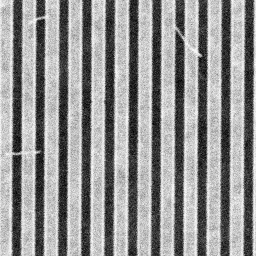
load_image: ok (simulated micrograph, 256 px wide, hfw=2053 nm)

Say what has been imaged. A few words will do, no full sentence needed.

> parallel lines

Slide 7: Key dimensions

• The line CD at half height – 89.3 nanometers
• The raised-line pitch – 186 nanometres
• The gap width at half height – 95.3 nanometres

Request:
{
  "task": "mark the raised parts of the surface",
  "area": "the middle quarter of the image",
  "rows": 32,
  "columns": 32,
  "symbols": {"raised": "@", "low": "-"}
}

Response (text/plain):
-@@@---@@@---@@@---@@----@@---@@
-@@@---@@@---@@@---@@----@@---@@
-@@@---@@@---@@@---@@----@@---@@
-@@@---@@@---@@@---@@----@@---@@
-@@@---@@@---@@@---@@----@@---@@
-@@@---@@@---@@@---@@----@@---@@
-@@@---@@@---@@@---@@----@@---@@
-@@@---@@@---@@@---@@----@@---@@
-@@@---@@@---@@@---@@----@@---@@
-@@@---@@@---@@@---@@----@@---@@
-@@@---@@@---@@@---@@----@@---@@
-@@@---@@@---@@@---@@----@@---@@
-@@@---@@@---@@@---@@----@@---@@
-@@@---@@@---@@@---@@----@@---@@
-@@@---@@@---@@@---@@----@@---@@
-@@@---@@@---@@@---@@----@@---@@
-@@@---@@@---@@@---@@----@@---@@
-@@@---@@@---@@@---@@----@@---@@
-@@@---@@@---@@@---@@----@@---@@
-@@@---@@@---@@@---@@----@@---@@
-@@@---@@@---@@@---@@----@@---@@
-@@@---@@@---@@@---@@----@@---@@
-@@@---@@@---@@@---@@----@@---@@
-@@@---@@@---@@@---@@----@@---@@
-@@@---@@@---@@@---@@----@@---@@
-@@@---@@@---@@@---@@----@@---@@
-@@@---@@@---@@@---@@----@@---@@
-@@@---@@@---@@@---@@----@@---@@
-@@@---@@@---@@@---@@----@@---@@
-@@@---@@@---@@@---@@----@@---@@
-@@@---@@@---@@@---@@----@@---@@
-@@@---@@@---@@@---@@----@@---@@